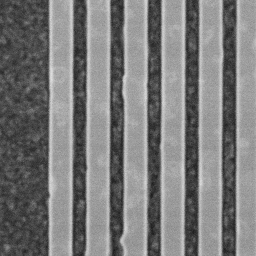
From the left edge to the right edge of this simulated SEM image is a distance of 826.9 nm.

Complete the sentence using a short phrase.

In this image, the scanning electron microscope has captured parallel lines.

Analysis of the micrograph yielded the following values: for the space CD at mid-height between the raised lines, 0.0484 micrometres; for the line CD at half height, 0.0726 microns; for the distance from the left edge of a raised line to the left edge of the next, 37.4 px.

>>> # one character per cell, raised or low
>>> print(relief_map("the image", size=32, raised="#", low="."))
......###..###..##..###..###..##
......###..###..##..###..###..##
......###..###..##..###..###..##
......###..###..##..###..###..##
......###..###..##..###..###..##
......###..###..##..###..###..##
......###..###..##..###..###..##
......###..###..##..###..###..##
......###..###..##..###..###..##
......###..###.###..###..###..##
......###..###.###..###..###..##
......###..###.###..###..###..##
......###..###..##..###..###..##
......###..###..##..###..###..##
......###..###..##..###..###..##
......###..###..##..###..###..##
......###..###..##..###..###..##
......###..###..##..###..###..##
......###..###..##..###..###..##
......###..###..##..###..###..##
......###..###..##..###..###..##
......###..###..##..###..###..##
......###..###..##..###..###..##
......###..###..##..###..###..##
......###..###..##..###..###..##
......###..###..##..###..###..##
......###..###..##..###..###..##
......###..###..##..###..###..##
......###..###..##..###..###..##
......###..###.###..###..###..##
......###..###.###..###..###..##
......###..###.###..###..###..##